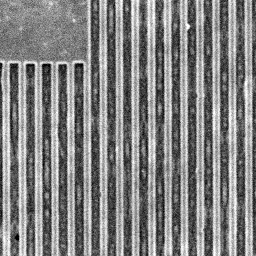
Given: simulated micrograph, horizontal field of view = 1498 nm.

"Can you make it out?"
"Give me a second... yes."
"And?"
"parallel lines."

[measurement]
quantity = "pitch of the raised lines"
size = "0.0946 um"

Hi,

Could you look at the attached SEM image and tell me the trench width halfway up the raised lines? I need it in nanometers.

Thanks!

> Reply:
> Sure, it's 57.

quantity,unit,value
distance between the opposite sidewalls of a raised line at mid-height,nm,40.2